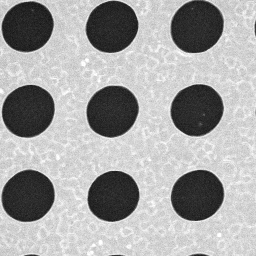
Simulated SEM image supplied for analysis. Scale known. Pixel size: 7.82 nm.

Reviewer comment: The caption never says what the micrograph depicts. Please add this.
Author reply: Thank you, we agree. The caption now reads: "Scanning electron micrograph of a regular array of holes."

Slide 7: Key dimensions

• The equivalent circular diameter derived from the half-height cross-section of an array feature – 0.406 micrometres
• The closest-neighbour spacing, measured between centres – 658 nanometers